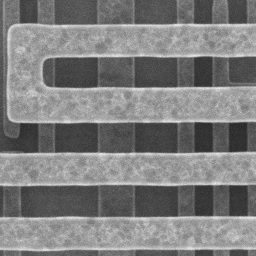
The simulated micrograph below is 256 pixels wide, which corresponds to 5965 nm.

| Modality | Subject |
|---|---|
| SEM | wiring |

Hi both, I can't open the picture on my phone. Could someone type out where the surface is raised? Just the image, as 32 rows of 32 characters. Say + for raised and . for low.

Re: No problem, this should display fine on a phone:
................................
................................
................................
.+++++++++++++++++++++++++++++++
.+++++++++++++++++++++++++++++++
.+++++++++++++++++++++++++++++++
.+++++++++++++++++++++++++++++++
.+++++..........................
.++++...........................
.++++...........................
.+++++..........................
.+++++++++++++++++++++++++++++++
.+++++++++++++++++++++++++++++++
.+++++++++++++++++++++++++++++++
.+++++++++++++++++++++++++++++++
................................
................................
................................
................................
++++++++++++++++++++++++++++++++
++++++++++++++++++++++++++++++++
++++++++++++++++++++++++++++++++
++++++++++++++++++++++++++++++++
................................
................................
................................
................................
++++++++++++++++++++++++++++++++
++++++++++++++++++++++++++++++++
++++++++++++++++++++++++++++++++
++++++++++++++++++++++++++++++++
................................